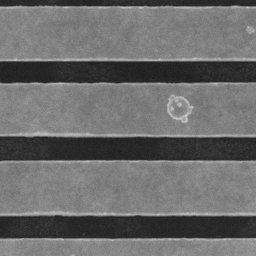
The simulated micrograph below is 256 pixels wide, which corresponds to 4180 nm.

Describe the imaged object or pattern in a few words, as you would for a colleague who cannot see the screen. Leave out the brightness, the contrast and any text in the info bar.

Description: lines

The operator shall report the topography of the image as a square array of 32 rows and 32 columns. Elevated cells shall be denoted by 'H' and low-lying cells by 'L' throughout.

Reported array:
LLLLLLLLLLLLLLLLLLLLLLLLLLLLLLLL
HHHHHHHHHHHHHHHHHHHHHHHHHHHHHHHH
HHHHHHHHHHHHHHHHHHHHHHHHHHHHHHHH
HHHHHHHHHHHHHHHHHHHHHHHHHHHHHHHH
HHHHHHHHHHHHHHHHHHHHHHHHHHHHHHHH
HHHHHHHHHHHHHHHHHHHHHHHHHHHHHHHH
HHHHHHHHHHHHHHHHHHHHHHHHHHHHHHHH
HHHHHHHHHHHHHHHHHHHHHHHHHHHHHHHH
LLLLLLLLLLLLLLLLLLLLLLLLLLLLLLLL
LLLLLLLLLLLLLLLLLLLLLLLLLLLLLLLL
LLHHHLHHHHLLHHLHHLHHHLHLLLHHHHHH
HHHHHHHHHHHHHHHHHHHHHHHHHHHHHHHH
HHHHHHHHHHHHHHHHHHHHHHHHHHHHHHHH
HHHHHHHHHHHHHHHHHHHHHHHHHHHHHHHH
HHHHHHHHHHHHHHHHHHHHHHHHHHHHHHHH
HHHHHHHHHHHHHHHHHHHHHHHHHHHHHHHH
HHHHHHHHHHHHHHHHHHHHHHHHHHHHHHHH
LLLLLLLLLLLLLLLLLLLLLLLLLLLLLLLL
LLLLLLLLLLLLLLLLLLLLLLLLLLLLLLLL
LLLLLLLLLLLLLLLLLLLLLLLLLLLLLLLL
HHHHHHHHHHHHHHHHHHHHHHHHHHHHHHHH
HHHHHHHHHHHHHHHHHHHHHHHHHHHHHHHH
HHHHHHHHHHHHHHHHHHHHHHHHHHHHHHHH
HHHHHHHHHHHHHHHHHHHHHHHHHHHHHHHH
HHHHHHHHHHHHHHHHHHHHHHHHHHHHHHHH
HHHHHHHHHHHHHHHHHHHHHHHHHHHHHHHH
HHHHHHHHHHHHHHHHHHHHHHHHHHHHHHHH
LLLLLLLLLLLLLLLLLLLLLLLLLLLLLLLL
LLLLLLLLLLLLLLLLLLLLLLLLLLLLLLLL
LLLLLLLLLLLLLLLLLLLLLLLLLLLLLLLL
HHHHHHHHHHHHHHHHHHHHHHHHHHHHHHHH
HHHHHHHHHHHHHHHHHHHHHHHHHHHHHHHH